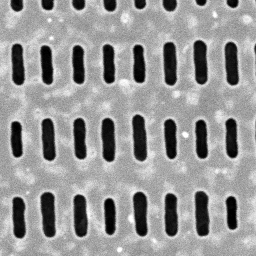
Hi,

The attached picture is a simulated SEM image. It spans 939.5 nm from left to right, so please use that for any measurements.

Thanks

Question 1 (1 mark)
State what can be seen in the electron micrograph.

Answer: a regular array of holes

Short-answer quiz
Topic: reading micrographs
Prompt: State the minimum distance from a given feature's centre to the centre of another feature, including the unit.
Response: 30.1 px